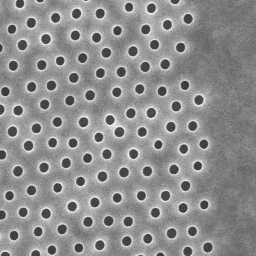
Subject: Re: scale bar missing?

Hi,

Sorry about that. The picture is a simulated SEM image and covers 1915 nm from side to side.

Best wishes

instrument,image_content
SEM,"a regular array of holes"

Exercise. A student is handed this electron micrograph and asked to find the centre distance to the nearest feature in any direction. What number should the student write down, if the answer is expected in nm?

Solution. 156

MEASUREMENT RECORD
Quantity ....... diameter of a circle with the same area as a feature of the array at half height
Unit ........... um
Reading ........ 0.0711